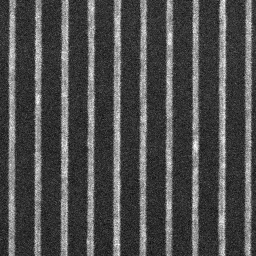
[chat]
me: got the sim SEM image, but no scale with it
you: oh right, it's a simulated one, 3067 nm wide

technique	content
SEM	parallel lines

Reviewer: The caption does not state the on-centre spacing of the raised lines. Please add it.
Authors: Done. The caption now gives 314 nm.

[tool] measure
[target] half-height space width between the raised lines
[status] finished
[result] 252 nanometres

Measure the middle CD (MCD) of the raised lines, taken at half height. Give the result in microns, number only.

0.0614